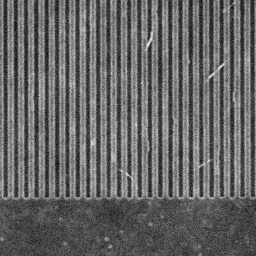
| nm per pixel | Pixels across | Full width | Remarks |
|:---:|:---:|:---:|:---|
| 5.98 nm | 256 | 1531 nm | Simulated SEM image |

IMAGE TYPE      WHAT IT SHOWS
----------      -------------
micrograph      parallel lines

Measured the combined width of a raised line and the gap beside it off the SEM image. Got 61.5 nanometres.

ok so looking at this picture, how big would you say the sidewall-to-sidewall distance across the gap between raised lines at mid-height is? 4.75 pixels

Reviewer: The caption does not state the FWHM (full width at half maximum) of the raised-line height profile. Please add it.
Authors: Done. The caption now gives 5.75 px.